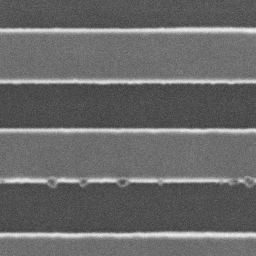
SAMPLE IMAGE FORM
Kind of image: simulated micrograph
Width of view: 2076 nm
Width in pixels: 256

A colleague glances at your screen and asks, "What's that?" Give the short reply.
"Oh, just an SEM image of lines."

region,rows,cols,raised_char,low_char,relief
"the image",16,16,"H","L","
LLLLLLLLLLLLLLLL
LLLLLLLLLLLLLLLL
HHHHHHHHHHHHHHHH
HHHHHHHHHHHHHHHH
HHHHHHHHHHHHHHHH
LLLLLLLLLLLLLLLL
LLLLLLLLLLLLLLLL
LLLLLLLLLLLLLLLL
HHHHHHHHHHHHHHHH
HHHHHHHHHHHHHHHH
HHHHHHHHHHHHHHHH
LLLHLLLHLLLLLLLH
LLLLLLLLLLLLLLLL
LLLLLLLLLLLLLLLL
LLLLLLLLLLLLLLLL
HHHHHHHHHHHHHHHH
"